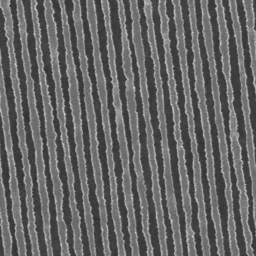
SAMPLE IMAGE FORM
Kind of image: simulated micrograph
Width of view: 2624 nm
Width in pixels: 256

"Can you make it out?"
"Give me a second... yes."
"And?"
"parallel lines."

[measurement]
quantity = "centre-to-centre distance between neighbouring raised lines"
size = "145 nanometers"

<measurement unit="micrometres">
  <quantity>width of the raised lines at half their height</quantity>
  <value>0.0712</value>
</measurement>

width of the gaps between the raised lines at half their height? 72.5 nanometers